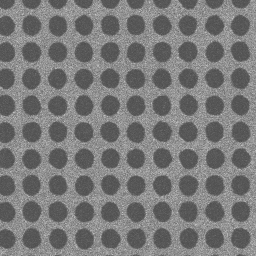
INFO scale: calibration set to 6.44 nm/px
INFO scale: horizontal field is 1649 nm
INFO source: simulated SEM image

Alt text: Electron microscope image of a regular array of holes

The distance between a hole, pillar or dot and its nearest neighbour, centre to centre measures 167 nm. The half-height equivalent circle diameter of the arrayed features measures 19.8 px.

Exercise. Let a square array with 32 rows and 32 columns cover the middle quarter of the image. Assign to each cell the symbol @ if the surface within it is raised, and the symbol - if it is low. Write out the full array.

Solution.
@@@@@@@@@@@@@@@@@@@@@@@@@@@@@@@@
@@@@--@@@@---@@@@--@@@@---@@@@--
@@@----@@-----@@----@@----@@@---
-@@----@@-----@-----@@-----@@---
-@@----@@-----@@----@@-----@@---
@@@----@@@---@@@----@@@---@@@@--
@@@@@@@@@@@@@@@@@@@@@@@@@@@@@@@@
@@@@@@@@@@@@@@@@@@@@@@@@@@@@@@@@
@@@----@@@---@@@----@@@---@@@---
-@@----@@-----@@----@@-----@@---
-@@-----@-----@-----@@-----@@---
-@@----@@-----@@----@@-----@@---
@@@@---@@@---@@@@--@@@@---@@@@--
@@@@@@@@@@@@@@@@@@@@@@@@@@@@@@@@
@@@@-@@@@@@-@@@@@@@@@@@@-@@@@@@-
@@@----@@----@@@----@@@---@@@---
-@@----@@-----@@----@@-----@@---
-@@----@@-----@-----@@-----@@---
@@@----@@@----@@----@@@----@@---
@@@@@@@@@@@-@@@@@--@@@@@@@@@@@@@
@@@@@@@@@@@@@@@@@@@@@@@@@@@@@@@@
@@@@--@@@@---@@@@--@@@@---@@@@--
-@@----@@-----@@----@@-----@@---
-@@-----@-----@@----@@-----@@---
-@@----@@-----@@----@@-----@@---
@@@----@@@---@@@----@@@---@@@@--
@@@@@@@@@@@@@@@@@@@@@@@@@@@@@@@@
@@@@@@@@@@@@@@@@@@@@@@@@@@@@@@@@
@@@----@@@---@@@----@@@---@@@---
-@@----@@-----@@----@@-----@@---
-@@----@@-----@@-----@-----@@---
-@@----@@@----@@----@@@----@@---